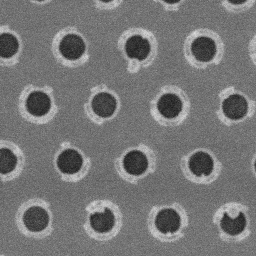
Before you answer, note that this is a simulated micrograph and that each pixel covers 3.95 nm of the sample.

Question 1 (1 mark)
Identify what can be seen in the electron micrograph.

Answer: a regular array of holes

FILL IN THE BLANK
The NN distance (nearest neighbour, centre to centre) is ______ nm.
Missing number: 258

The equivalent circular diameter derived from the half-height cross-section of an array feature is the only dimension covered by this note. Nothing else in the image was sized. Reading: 110 nm